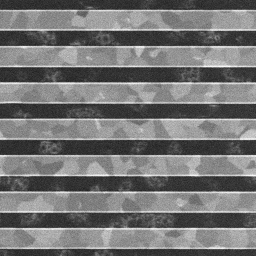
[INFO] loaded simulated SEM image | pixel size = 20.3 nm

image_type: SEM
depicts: parallel lines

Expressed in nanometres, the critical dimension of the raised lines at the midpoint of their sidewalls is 403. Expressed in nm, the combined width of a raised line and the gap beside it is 737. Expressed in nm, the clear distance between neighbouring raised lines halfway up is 337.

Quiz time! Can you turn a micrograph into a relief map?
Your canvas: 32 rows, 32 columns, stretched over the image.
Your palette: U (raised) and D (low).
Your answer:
DDDDDDDDDDDDDDDDDDDDDDDDDDDDDDDD
UUUUUUUUUUUUUUUUUUUUUUUUUUUUUUUU
UUUUUUUUUUUUUUUUUUUUUUUUUUUUUUUU
UUUUUUUUUUUUUUUUUUUUUUUUUUUUUUUU
DDDDDDDDDDDDDUDDDDDDDDDDDDDDDDDD
DDDDDDDDDDDDDDDDDDDDDDDDDDDDDDDD
UUUUUUUUUUUUUUUUUUUUUUUUUUUUUUUU
UUUUUUUUUUUUUUUUUUUUUUUUUUUUUUUU
DDDDDDDDDDDDDDDDDDDDDDDDDDDDDDDD
DDDDDDDDDDDDDDDDDDDDDDDDDDDDDDDD
UUUUUUUUUUUUUUUUUUUUUUUUUUUUUUUU
UUUUUUUUUUUUUUUUUUUUUUUUUUUUUUUU
UUUUUUUUUUUUUUUUUUUUUUUUUUUUUUUU
DDDDDDDDDDDDDDDDDDDDDDDDDDDDDDDD
DDDDDDDDDDDDDDDDDDDDDDDDDDDDDDDD
UUUUUUUUUUUUUUUUUUUUUUUUUUUUUUUU
UUUUUUUUUUUUUUUUUUUUUUUUUUUUUUUU
DDDDDUDDDDDDDDDDDDDDDDDDDDDDDDDD
DDDDDDDDDDDDDDDDDDDDDDDDDDDDDDDD
DDDDDDUUDDDDDDDDDDDDDDDDDDDDDDDD
UUUUUUUUUUUUUUUUUUUUUUUUUUUUUUUU
UUUUUUUUUUUUUUUUUUUUUUUUUUUUUUUU
DDDDDDDDDDDDDDDDDDDDDDDDDDDDDDDD
DDDDDDDDDDDDDDDDDDDDDDDDDDDDDDDD
UUUUUUUUUUUUUUUUUUUUUUUUUUUUUUUU
UUUUUUUUUUUUUUUUUUUUUUUUUUUUUUUU
DDDDDDDDDDUDDDDDUDDDDDDDDDDDDDDD
DDDDDDDDDDDDDDDDDDDDDDDDDDDDDDDD
DDDDDDDDDDDDDDDDDDDDDDDDDDDDDDDD
UUUUUUUUUUUUUUUUUUUUUUUUUUUUUUUU
UUUUUUUUUUUUUUUUUUUUUUUUUUUUUUUU
DDDDDDDDDDDDDDDDDDDDDDDDDDDDDDDD